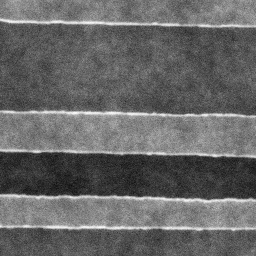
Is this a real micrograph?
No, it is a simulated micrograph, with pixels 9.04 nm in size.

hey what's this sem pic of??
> lines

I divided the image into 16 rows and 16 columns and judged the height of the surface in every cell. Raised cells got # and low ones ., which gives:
################
........########
................
................
................
................
................
################
################
..#.############
................
................
#############.##
################
................
................